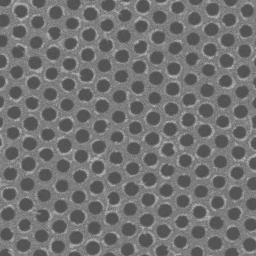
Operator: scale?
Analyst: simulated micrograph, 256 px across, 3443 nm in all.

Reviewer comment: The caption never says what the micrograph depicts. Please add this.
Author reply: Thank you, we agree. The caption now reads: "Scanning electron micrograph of a regular array of holes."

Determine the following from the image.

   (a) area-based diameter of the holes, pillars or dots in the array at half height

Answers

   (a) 0.179 micrometres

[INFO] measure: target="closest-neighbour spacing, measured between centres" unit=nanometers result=266